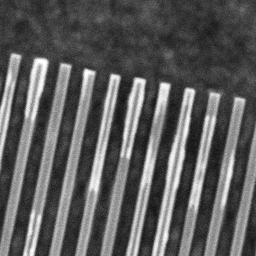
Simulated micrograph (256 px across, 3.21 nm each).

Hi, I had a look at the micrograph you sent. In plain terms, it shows parallel lines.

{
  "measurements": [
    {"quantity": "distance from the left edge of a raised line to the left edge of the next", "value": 81.3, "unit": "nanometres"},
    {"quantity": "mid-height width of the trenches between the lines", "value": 15.3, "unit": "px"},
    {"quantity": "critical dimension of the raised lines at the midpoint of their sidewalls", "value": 9.69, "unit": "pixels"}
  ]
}